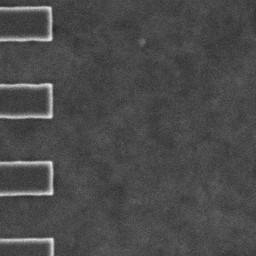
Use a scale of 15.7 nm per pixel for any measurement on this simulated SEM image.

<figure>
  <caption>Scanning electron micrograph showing wiring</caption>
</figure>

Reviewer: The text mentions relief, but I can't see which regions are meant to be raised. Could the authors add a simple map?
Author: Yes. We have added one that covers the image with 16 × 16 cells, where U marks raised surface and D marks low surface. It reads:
UUUDDDDDDDDDDDDD
UUUDDDDDDDDDDDDD
UUDDDDDDDDDDDDDD
DDDDDDDDDDDDDDDD
DDDDDDDDDDDDDDDD
UUUDDDDDDDDDDDDD
UUUDDDDDDDDDDDDD
DDDDDDDDDDDDDDDD
DDDDDDDDDDDDDDDD
DDDDDDDDDDDDDDDD
UUUDDDDDDDDDDDDD
UUUDDDDDDDDDDDDD
DDDDDDDDDDDDDDDD
DDDDDDDDDDDDDDDD
DDDDDDDDDDDDDDDD
UUUDDDDDDDDDDDDD